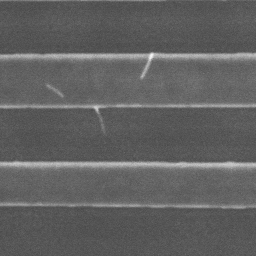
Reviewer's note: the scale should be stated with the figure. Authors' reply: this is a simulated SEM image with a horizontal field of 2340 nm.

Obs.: lines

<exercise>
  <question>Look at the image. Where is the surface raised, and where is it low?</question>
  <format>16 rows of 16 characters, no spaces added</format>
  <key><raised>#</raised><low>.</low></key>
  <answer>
................
................
................
################
################
################
################
................
................
................
################
################
################
................
................
................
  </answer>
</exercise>